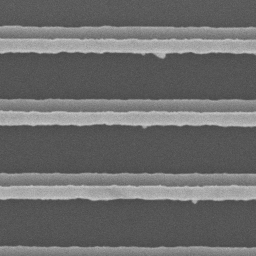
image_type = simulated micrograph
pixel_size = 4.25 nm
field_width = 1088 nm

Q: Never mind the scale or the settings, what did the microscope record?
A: lines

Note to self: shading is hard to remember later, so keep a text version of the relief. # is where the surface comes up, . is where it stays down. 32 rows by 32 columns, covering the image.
................................
................................
................................
########..#########.##.###......
################################
################################
################################
................................
................................
................................
................................
................................
###################.######...#..
################################
################################
############.#.#################
................................
................................
................................
................................
................................
................................
################################
################################
################################
................................
................................
................................
................................
................................
................................
################################